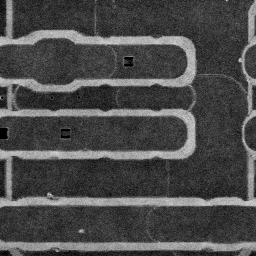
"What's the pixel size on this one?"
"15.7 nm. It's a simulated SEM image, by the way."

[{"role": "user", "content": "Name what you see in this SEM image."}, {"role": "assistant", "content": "wiring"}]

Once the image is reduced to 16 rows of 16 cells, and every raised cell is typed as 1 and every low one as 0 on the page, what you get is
0000000000000000
0000000000000000
0011110000000000
1111111111110000
1111111111110000
0011100000000000
0000000000000000
1111111111110000
1111111111110000
1111111111110000
0000000000000000
0000000000000000
0000000000000000
1111111111111111
1111111111111111
0000000000000000